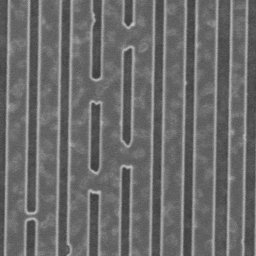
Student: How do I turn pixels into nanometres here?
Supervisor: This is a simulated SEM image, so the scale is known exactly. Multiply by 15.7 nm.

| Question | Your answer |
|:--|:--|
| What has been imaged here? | parallel lines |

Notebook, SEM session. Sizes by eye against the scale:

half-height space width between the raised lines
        145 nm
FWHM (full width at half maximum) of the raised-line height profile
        0.335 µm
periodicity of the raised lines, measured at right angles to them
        492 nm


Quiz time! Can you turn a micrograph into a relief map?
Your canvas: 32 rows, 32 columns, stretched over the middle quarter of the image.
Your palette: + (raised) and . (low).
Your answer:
..+++++..++++++..+++++...+++++..
..+++++..++++++..+++++...+++++..
..+++++..++++++..+++++...+++++..
..+++++..++++++..+++++...+++++..
..+++++++++++++..+++++...+++++..
..+++++++++++++..+++++...+++++..
..++++++++++++...+++++...+++++..
.+++++++++++++...+++++...+++++..
.+++++++++++++...+++++...+++++..
.+++++++++++++...+++++...+++++..
.++++++..+++++...+++++...+++++..
.++++++..+++++...+++++...+++++..
.++++++..+++++...+++++...+++++..
.+++++...+++++...+++++...+++++..
.+++++...+++++...+++++...+++++..
.+++++...+++++...+++++...+++++..
.+++++...+++++...+++++...+++++..
.+++++...+++++...+++++...+++++..
.+++++...++++++..+++++...+++++..
.+++++...++++++..+++++...+++++..
.+++++...+++++++++++++...+++++..
.+++++...+++++++++++++...+++++..
.+++++...+++++++++++++...+++++..
.+++++...+++++++++++++...+++++..
.+++++...+++++++++++++...+++++..
.++++++..+++++++++++++...+++++..
.++++++..+++++..++++++...+++++..
.+++++++++++++...+++++...+++++..
.+++++++++++++...+++++...+++++..
.+++++++++++++...+++++...+++++..
.+++++++++++++...+++++...+++++..
.+++++++++++++...+++++...+++++..